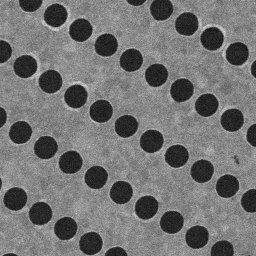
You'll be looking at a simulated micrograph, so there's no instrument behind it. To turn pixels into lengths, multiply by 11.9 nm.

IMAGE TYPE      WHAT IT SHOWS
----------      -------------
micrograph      a regular array of holes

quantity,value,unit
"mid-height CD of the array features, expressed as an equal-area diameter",292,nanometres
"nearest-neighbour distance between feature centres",348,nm